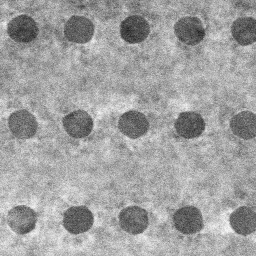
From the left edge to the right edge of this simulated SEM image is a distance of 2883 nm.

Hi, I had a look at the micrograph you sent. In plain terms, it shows a regular array of raised bodies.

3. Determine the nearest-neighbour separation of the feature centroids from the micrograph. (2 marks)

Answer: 625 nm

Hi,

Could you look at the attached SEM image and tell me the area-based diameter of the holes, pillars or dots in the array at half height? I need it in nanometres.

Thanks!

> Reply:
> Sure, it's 354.